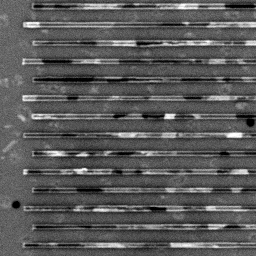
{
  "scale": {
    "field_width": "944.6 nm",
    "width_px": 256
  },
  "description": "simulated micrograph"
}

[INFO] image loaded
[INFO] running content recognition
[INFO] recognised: parallel lines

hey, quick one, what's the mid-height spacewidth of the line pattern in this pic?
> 50.7 nm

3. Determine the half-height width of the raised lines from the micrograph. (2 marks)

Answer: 16.1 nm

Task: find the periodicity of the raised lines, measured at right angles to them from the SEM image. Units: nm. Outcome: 67.8